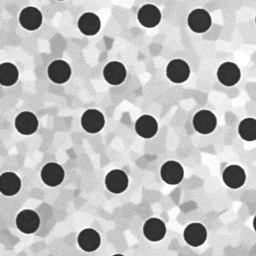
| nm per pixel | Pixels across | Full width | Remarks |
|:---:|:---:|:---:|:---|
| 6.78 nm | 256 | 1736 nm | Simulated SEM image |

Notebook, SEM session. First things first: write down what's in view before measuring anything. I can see a regular array of holes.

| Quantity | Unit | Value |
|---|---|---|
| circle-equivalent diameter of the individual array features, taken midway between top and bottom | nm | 163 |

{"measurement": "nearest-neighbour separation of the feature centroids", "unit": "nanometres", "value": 359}